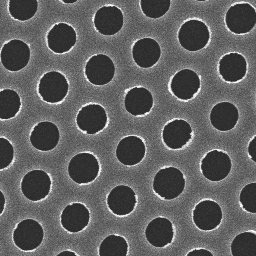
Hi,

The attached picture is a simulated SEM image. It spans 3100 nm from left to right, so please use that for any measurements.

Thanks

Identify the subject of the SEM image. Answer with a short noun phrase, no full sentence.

a regular array of holes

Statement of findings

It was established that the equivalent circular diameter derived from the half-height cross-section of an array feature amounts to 356 nm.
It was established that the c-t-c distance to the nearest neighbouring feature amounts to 602 nm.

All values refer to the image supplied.